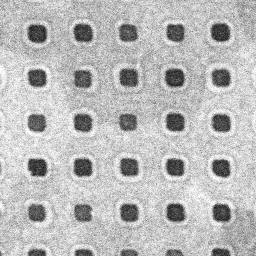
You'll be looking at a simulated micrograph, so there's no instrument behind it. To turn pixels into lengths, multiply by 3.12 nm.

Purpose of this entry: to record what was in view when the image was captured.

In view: a regular array of holes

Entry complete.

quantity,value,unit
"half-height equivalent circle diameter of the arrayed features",63.9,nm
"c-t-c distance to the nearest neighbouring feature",140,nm